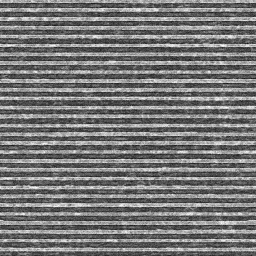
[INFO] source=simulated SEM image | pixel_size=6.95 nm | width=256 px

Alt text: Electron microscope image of parallel lines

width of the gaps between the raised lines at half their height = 0.04 micrometres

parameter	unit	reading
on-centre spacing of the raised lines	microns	0.0615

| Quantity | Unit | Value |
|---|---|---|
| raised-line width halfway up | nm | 23.5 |